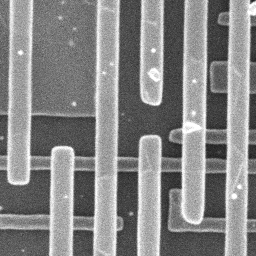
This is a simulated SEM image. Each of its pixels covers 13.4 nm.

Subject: wiring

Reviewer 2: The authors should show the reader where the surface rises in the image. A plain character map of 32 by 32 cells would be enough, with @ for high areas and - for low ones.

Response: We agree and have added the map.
-@@@--------@@@---@@---@@@---@@@
-@@@--------@@@---@@---@@@---@@@
-@@@--------@@@---@@---@@@---@@-
-@@@--------@@@---@@---@@@---@@-
-@@@--------@@@---@@---@@@---@@-
-@@@--------@@@---@@---@@@---@@-
-@@@--------@@@---@@---@@@---@@-
-@@@--------@@@---@@---@@@---@@-
-@@@--------@@@---@@---@@@---@@-
-@@@--------@@@---@@---@@@---@@-
-@@@--------@@@---@@---@@@---@@-
-@@@--------@@@---@@---@@@---@@-
-@@@--------@@@---@@---@@@---@@-
-@@@--------@@@--------@@@---@@-
-@@@--------@@@--------@@@--@@@-
-@@@--------@@@--------@@@--@@@-
-@@@--------@@@--------@@@--@@@-
-@@@--------@@@---@@---@@@--@@@-
-@@@---@@---@@@--@@@---@@@--@@@-
-@@@--@@@---@@@--@@@---@@@--@@@-
-@@@--@@@---@@@--@@@---@@@--@@@-
-@@@--@@@---@@@--@@@---@@@--@@@-
-@@@--@@@---@@---@@@---@@@--@@@-
------@@@---@@---@@@---@@---@@@-
------@@@---@@---@@@---@@---@@@-
------@@@---@@---@@@---@@---@@@-
------@@@---@@---@@@---@@---@@@-
------@@@---@@---@@@---@@---@@@-
------@@@---@@---@@@--------@@@-
------@@@---@@---@@@--------@@@-
------@@@---@@---@@@--------@@@-
------@@@---@@---@@@--------@@@-